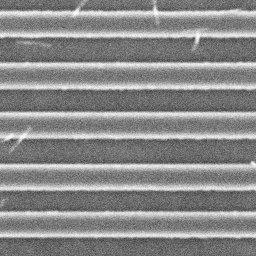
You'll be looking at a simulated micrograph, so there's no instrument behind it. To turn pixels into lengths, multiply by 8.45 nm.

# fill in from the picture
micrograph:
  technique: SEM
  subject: lines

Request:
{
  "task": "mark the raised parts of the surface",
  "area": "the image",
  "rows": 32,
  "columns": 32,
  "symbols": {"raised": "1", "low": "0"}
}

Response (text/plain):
00000000000000000000000000000000
10101110111010011111000110111111
11111111111111111111111111111111
11111111111111111111111111111111
11111111111111111111111111111111
00000000000000000000000000000000
00000000000000000000000000000000
00000000000000000000000000000000
11111111111111111111111111111111
11111111111111111111111111111111
11111111111111111111111111111111
00000000000000000000000000000000
00000000000000000000000000000000
00000000000000000000000000000000
11111111111111111111111111111111
11111111111111111111111111111111
11111111111111111111111111111111
00000000000000000000000000000000
00000000000000000000000000000000
00000000000000000000000000000000
00000000000000000000000000000001
11111111111111111111111111111111
11111111111111111111111111111111
11111111111111111111111111111111
00000000000000000000000000000000
00000000000000000000000000000000
00000011000000000000000000000000
11111111111111111111111111111111
11111111111111111111111111111111
11111111111111111111111111111111
00000000000000000000000000000000
00000000000000000000000000000000